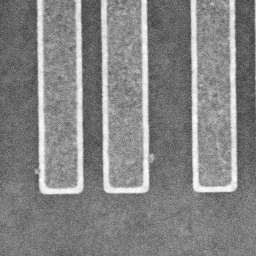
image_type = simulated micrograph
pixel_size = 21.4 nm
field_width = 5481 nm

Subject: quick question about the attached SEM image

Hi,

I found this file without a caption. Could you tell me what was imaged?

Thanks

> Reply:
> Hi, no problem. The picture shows wiring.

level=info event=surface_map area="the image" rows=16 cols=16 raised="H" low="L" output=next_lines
LLLHHLLHHLLLHHLL
LLLHHLLHHLLLHHLL
LLLHHLLHHLLLHHLL
LLLHHLLHHLLLHHLL
LLLHHLLHHLLLHHLL
LLLHHLLHHLLLHHHL
LLLHHLLHHLLLHHHL
LLLHHLLHHLLLHHHL
LLLHHLLHHLLLHHHL
LLLHHLLHHLLLHHHL
LLLHHLLHHLLLHHHL
LLLHHLLHHLLLHHLL
LLLLLLLLLLLLLLLL
LLLLLLLLLLLLLLLL
LLLLLLLLLLLLLLLL
LLLLLLLLLLLLLLLL